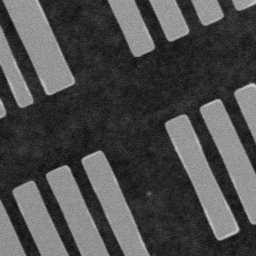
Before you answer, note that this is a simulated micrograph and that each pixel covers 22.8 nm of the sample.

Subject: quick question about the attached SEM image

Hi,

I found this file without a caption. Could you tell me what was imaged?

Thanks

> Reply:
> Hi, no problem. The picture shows groups of lines, slits or small figures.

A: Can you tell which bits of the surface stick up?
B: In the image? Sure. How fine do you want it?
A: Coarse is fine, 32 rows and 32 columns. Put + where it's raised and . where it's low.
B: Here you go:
.++++.........+++..+++..+++..+++
.++++.........+++..++++..+++....
..++++.........+++..+++..++.....
..++++.........+++..+++.........
+..++++.........+++..++.........
+..++++.........+++.............
+..+++++.........+..............
++..++++........................
++..+++++.......................
.++..++++.......................
.++..++++.......................
..++..+.......................++
..++..........................++
.........................+++..++
......................+..+++..++
.....................+++..+++..+
.....................+++..+++..+
.....................++++..+++..
......................+++..+++..
...........++.........+++...+++.
..........++++.........+++..+++.
......+++..+++.........+++...+++
......+++..+++..........+++..+++
..+++.++++..+++.........+++..+++
..+++..+++..+++..........+++..++
..+++..++++..+++.........+++..++
+..+++..+++..+++..........+++..+
+..+++..+++...+++.........+++..+
++..+++..+++..+++..........+++..
++..+++..+++...++..........+....
+++..+++..+++..+++..............
+++..+++..+++..+++..............